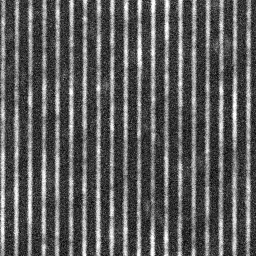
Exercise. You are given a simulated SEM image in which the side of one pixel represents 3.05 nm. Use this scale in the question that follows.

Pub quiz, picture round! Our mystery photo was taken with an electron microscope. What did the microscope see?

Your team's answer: parallel lines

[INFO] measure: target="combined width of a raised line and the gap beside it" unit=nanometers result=41.7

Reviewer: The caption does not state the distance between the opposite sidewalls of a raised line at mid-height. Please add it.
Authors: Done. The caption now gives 9.5 nm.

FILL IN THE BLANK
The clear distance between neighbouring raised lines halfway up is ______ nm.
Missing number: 33.2